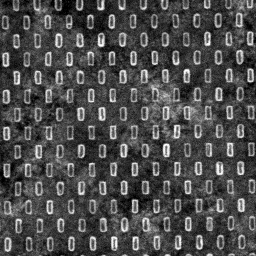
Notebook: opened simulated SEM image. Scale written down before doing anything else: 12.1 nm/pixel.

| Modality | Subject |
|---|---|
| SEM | a regular array of raised bodies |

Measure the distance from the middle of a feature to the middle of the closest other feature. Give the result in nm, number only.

253